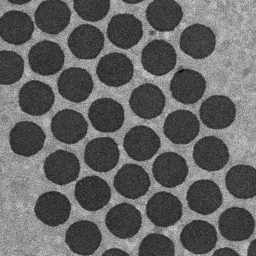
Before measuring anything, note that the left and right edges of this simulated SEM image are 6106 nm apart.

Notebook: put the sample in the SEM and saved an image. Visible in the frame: a regular array of holes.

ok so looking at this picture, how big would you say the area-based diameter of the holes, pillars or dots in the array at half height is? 871 nm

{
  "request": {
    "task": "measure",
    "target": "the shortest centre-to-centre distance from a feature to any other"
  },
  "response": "952 nanometres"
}